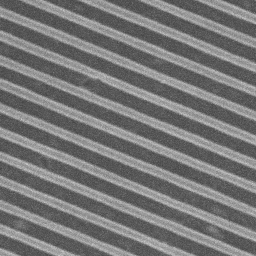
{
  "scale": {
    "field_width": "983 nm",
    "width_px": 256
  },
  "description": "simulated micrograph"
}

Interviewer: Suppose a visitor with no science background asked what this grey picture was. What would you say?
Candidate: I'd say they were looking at parallel lines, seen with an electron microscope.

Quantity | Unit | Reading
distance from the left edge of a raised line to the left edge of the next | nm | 85.6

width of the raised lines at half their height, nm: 28.4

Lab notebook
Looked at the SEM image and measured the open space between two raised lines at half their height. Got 56.4 nanometres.